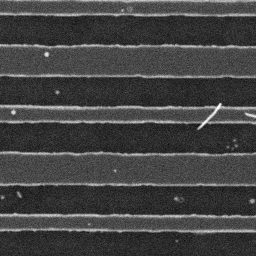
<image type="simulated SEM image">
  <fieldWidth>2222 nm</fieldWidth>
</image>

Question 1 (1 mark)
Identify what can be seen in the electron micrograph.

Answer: lines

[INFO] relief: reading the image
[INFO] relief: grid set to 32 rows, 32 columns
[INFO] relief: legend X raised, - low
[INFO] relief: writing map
XXXXXXXXXXXXXXXXXXXXXXXXXXXXXXXX
XXXXXXXXXXXXXXXXXXXXXXXXXXXXXXXX
--------------------------------
--------------------------------
--------------------------------
--------------------------------
XXXXXXXXXXXXXXXXXXXXXXXXXXXXXXXX
XXXXXXXXXXXXXXXXXXXXXXXXXXXXXXXX
XXXXXXXXXXXXXXXXXXXXXXXXXXXXXXXX
-XXXXXXXXXXXXXXXXXXXXXXXXXXXXXXX
--------------------------------
--------------------------------
--------------------------------
XXXXXXXXXXXXXXXXXXXXXXXXXXXXXXXX
XXXXXXXXXXXXXXXXXXXXXXXXXXXXXXXX
-------------------------X------
--------------------------------
--------------------------------
--------------------------------
XXXXXXXXXXXXXXXXXXXXXXXXXXXXXXXX
XXXXXXXXXXXXXXXXXXXXXXXXXXXXXXXX
XXXXXXXXXXXXXXXXXXXXXXXXXXXXXXXX
XXXXXXXXXXXXXXXXXXXXXXXXXXXXXXXX
--------------------------------
--------------------------------
--------------------------------
--------------------------------
XXXXXXXXXXXXXXXXXXXXXXXXXXXXXXXX
XXXXXXXXXXXXXXXXXXXXXXXXXXXXXXXX
--------------------------------
--------------------------------
--------------------------------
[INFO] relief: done